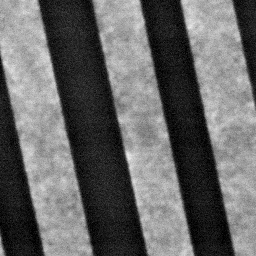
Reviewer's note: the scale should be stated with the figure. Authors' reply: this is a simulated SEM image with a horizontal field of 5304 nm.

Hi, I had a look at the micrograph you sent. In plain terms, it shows lines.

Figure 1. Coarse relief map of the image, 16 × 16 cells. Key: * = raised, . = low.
**....***..****.
***...***...***.
***...***...***.
***....**...***.
***....***..***.
.***...***..****
.***...***...***
.***...***...***
.***....***..***
.***....***..***
..***...***...**
..***...***...**
..***....**...**
..***....***..**
...**....***..**
...***...***...*